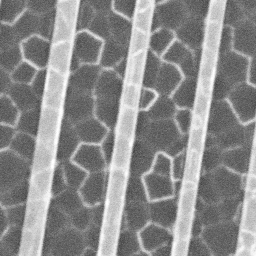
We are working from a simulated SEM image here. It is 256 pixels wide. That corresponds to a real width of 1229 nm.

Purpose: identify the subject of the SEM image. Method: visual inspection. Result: one or a few lines or trenches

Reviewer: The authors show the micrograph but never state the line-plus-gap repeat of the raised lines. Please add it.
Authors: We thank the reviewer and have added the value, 0.354 um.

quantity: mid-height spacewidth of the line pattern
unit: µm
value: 0.266